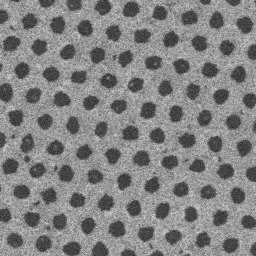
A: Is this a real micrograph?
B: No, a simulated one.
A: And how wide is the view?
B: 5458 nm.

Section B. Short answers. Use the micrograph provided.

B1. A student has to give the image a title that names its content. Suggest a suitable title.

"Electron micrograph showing a regular array of holes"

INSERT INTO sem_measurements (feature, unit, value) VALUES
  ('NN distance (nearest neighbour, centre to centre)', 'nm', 585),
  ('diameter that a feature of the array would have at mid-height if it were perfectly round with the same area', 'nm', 337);